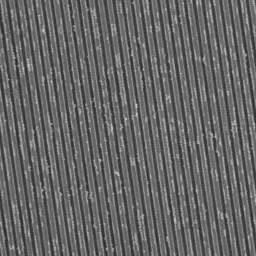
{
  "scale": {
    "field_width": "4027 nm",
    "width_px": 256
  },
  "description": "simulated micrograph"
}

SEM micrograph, parallel lines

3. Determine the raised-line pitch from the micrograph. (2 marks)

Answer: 138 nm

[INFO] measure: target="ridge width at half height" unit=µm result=0.0837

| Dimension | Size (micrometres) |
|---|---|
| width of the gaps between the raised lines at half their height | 0.0564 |